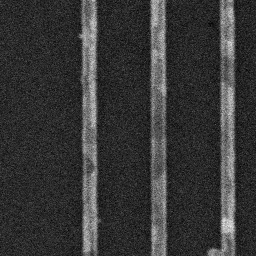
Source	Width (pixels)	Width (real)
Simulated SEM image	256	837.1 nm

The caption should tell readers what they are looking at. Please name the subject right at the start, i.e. one or a few lines or trenches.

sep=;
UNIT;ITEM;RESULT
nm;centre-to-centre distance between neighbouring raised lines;226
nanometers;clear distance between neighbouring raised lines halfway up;186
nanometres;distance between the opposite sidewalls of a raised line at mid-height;38.7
